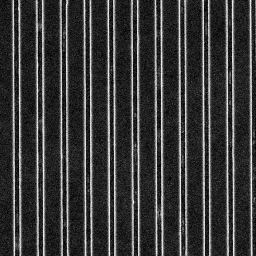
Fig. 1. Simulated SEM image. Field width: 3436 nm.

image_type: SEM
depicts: parallel lines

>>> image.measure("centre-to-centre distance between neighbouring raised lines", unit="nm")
318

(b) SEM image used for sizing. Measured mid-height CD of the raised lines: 258 nm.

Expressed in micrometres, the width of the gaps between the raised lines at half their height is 0.0671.